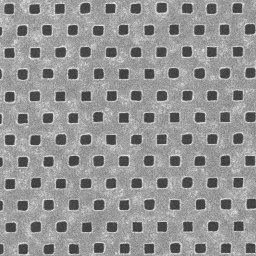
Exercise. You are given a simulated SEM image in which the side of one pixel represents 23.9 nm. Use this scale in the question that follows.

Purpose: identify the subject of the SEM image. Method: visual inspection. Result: a regular array of holes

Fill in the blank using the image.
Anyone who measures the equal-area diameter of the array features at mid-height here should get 11.3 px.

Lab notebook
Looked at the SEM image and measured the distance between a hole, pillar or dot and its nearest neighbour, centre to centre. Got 590 nm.